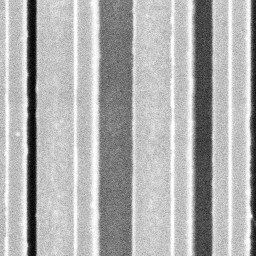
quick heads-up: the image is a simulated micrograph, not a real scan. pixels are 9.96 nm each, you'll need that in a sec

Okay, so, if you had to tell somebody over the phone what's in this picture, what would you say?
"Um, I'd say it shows lines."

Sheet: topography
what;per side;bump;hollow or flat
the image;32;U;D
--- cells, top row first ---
UUUDDUUUUUUUDDDDDUUUUUUUDDDUUUUD
UUUDDUUUUUUUDDDDDUUUUUUUDDDUUUUD
UUUDDUUUUUUUDDDDDUUUUUUUDDDUUUUD
UUUDDUUUUUUUDDDDDUUUUUUUDDDUUUUD
UUUDDUUUUUUUDDDDDUUUUUUUDDDUUUUD
UUUDDUUUUUUUDDDDDUUUUUUUDDDUUUUD
UUUDDUUUUUUUDDDDDUUUUUUUDDDUUUUD
UUUDDUUUUUUUDDDDDUUUUUUUDDDUUUUD
UUUDDUUUUUUUDDDDDUUUUUUUDDDUUUUD
UUUDDUUUUUUUDDDDDUUUUUUUDDDUUUUD
UUUDDUUUUUUUDDDDDUUUUUUUDDDUUUUD
UUUDDUUUUUUUDDDDDUUUUUUUDDDUUUUD
UUUDDUUUUUUUDDDDDUUUUUUUDDDUUUUD
UUUDDUUUUUUUDDDDDUUUUUUUDDDUUUUD
UUUDDUUUUUUUDDDDDUUUUUUUDDDUUUUD
UUUDDUUUUUUUDDDDDUUUUUUUDDDUUUUD
UUUDDUUUUUUUDDDDDUUUUUUUDDDUUUUD
UUUDDUUUUUUUDDDDDUUUUUUUDDDUUUUD
UUUDDUUUUUUUDDDDDUUUUUUUDDDUUUUD
UUUDDUUUUUUUDDDDDUUUUUUUDDDUUUUD
UUUDDUUUUUUUDDDDDUUUUUUUDDDUUUUD
UUUDDUUUUUUUDDDDDUUUUUUUDDDUUUUD
UUUDDUUUUUUUDDDDDUUUUUUUDDDUUUUD
UUUDDUUUUUUUDDDDDUUUUUUUDDDUUUUD
UUUDDUUUUUUUDDDDDUUUUUUUDDDUUUUD
UUUDDUUUUUUUDDDDDUUUUUUUDDDUUUUD
UUUDDUUUUUUUDDDDDUUUUUUUDDDUUUUD
UUUDDUUUUUUUDDDDDUUUUUUUDDDUUUUD
UUUDDUUUUUUUDDDDDUUUUUUUDDDUUUUD
UUUDDUUUUUUUDDDDDUUUUUUUDDDUUUUD
UUUDDUUUUUUUDDDDDUUUUUUUDDDUUUUD
UUUDDUUUUUUUDDDDDUUUUUUUDDDUUUUD